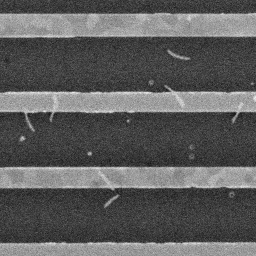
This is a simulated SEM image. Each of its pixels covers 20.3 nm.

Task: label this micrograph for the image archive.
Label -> lines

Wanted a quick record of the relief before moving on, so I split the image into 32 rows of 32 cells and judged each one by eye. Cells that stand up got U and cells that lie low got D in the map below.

DDDDDDDDDDDDDDDDDDDDDDDDDDDDDDDD
DDDDDDDDDDDDDDDDDDDDDDDDDDDDDDDD
UUUUUUUUUUUUUUUUUUUUUUUUUUUUUUUU
UUUUUUUUUUUUUUUUUUUUUUUUUUUUUUUU
UUUUUUUUUUDDDDDDDDDDDDDDDDDDDDDD
DDDDDDDDDDDDDDDDDDDDDDDDDDDDDDDD
DDDDDDDDDDDDDDDDDDDDDDDDDDDDDDDD
DDDDDDDDDDDDDDDDDDDDDDDDDDDDDDDD
DDDDDDDDDDDDDDDDDDDDDDDDDDDDDDDD
DDDDDDDDDDDDDDDDDDDDDDDDDDDDDDDD
DDDDDDDDDDDDDDDDDDDDDDDDDDDDDDDD
DDDDDDDDDDDDDDDDDDDDDUDDDDDDDDDD
UUUUUUUUUUUUUUUUUUUUUUUUUUUUUUUU
UUUUUUUUUUUUUUUUUUUUUUUUUUUUUUUU
DDDDDDDDDDDDDDDDDDDDDDDDDDDDDDDD
DDDDDDDDDDDDDDDDDDDDDDDDDDDDDDDD
DDDDDDDDDDDDDDDDDDDDDDDDDDDDDDDD
DDDDDDDDDDDDDDDDDDDDDDDDDDDDDDDD
DDDDDDDDDDDDDDDDDDDDDDDDDDDDDDDD
DDDDDDDDDDDDDDDDDDDDDDDDDDDDDDDD
DDDDDDDDDDDDDDDDDDDDDDDDDDDDDDDD
UUUUUUUUUUUUUUUUUUUUUUUUUUUUUUUU
UUUUUUUUUUUUUUUUUUUUUUUUUUUUUUUU
DDDDDDDDDDDDDUUDDDDDDDDDDDDDDDDD
DDDDDDDDDDDDDDDDDDDDDDDDDDDDDDDD
DDDDDDDDDDDDDDDDDDDDDDDDDDDDDDDD
DDDDDDDDDDDDDDDDDDDDDDDDDDDDDDDD
DDDDDDDDDDDDDDDDDDDDDDDDDDDDDDDD
DDDDDDDDDDDDDDDDDDDDDDDDDDDDDDDD
DDDDDDDDDDDDDDDDDDDDDDDDDDDDDDDD
DDDDDDUDDDDUDUUUDDUUDUDUUUUUUUUU
UUUUUUUUUUUUUUUUUUUUUUUUUUUUUUUU